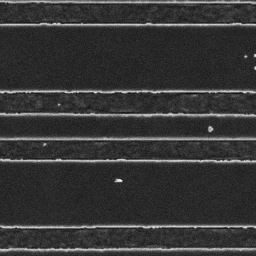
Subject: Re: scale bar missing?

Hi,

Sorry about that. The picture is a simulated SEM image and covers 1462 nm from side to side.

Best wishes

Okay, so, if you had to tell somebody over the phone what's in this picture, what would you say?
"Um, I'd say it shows lines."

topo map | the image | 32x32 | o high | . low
................................
................................
................................
oooooooooooooooooooooooooooooooo
oooooooooooooooooooooooooooooooo
oooooooooooooooooooooooooooooooo
oooooooooooooooooooooooooooooooo
oooooooooooooooooooooooooooooooo
oooooooooooooooooooooooooooooooo
oooooooooooooooooooooooooooooooo
oooooooooooooooooooooooooooooooo
oo.o....oo.ooooo.o.o....o.o...oo
................................
................................
oooooooooooooooooooooooooooooooo
oooooooooooooooooooooooooooooooo
oooooooooooooooooooooooooooooooo
................................
................................
................................
oooooooooooooooooooooooooooooooo
oooooooooooooooooooooooooooooooo
oooooooooooooooooooooooooooooooo
oooooooooooooooooooooooooooooooo
oooooooooooooooooooooooooooooooo
oooooooooooooooooooooooooooooooo
oooooooooooooooooooooooooooooooo
oooooooooooooooooooooooooooooooo
................................
................................
................................
oooooooooooooooooooooooooooooooo